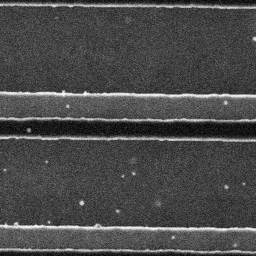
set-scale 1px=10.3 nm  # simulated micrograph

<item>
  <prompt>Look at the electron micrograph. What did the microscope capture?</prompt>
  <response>lines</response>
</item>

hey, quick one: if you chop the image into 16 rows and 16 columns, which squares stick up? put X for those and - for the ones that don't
-------------XXX
----------------
----------------
----------------
----------------
----------------
XXXXXXXXXXXXXXXX
XXXXXXXXXXXXXXXX
XXXXXXXXXXXXXXXX
----------------
----------------
----------------
----------------
----------------
XXXXXXXXXXXXXXXX
XXXXXXXXXXXXXXXX